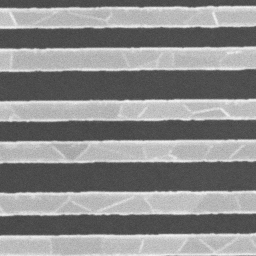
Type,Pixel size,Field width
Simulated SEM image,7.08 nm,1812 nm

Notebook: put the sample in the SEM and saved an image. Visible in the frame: lines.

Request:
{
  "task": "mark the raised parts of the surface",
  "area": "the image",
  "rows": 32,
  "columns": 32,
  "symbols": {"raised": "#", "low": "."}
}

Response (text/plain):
................................
################################
################################
................................
................................
................................
################################
################################
################################
................................
................................
................................
................................
################################
################################
................................
................................
................................
################################
################################
................................
................................
................................
................................
################################
################################
################################
................................
................................
...........##....###############
################################
################################